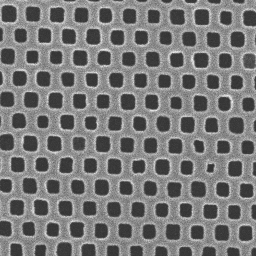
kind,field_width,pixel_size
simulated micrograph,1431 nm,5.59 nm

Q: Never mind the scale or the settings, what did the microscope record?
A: a regular array of holes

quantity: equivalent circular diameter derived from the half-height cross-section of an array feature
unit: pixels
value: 15.2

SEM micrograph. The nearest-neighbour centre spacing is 0.134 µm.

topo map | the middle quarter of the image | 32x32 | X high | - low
XXXXXXXXXXXXXXXX-XXXX---XXX---XX
XXXXXXXXXXXXXXXXXXXXXXXXXXXXXXXX
--XXXX--XXXX---XXX--XXXXXXXXXX--
---XX----XX----XX----XXX---XX---
---XXX---XX----XX----XXX---XX---
--XXXX--XXXX--XXXX--XXXX---XXX--
XXXXXXXXXXXXXXXXXXXXXXXXXXXXXXXX
XXX--XXXX--XXXX--XXXX-XXXXXXXXXX
XX---XXX---XXX----XX----XXX--XXX
XX---XXX---XXX----XX----XXX---XX
XX---XXX---XXX----XX----XX----XX
XXXXXXXXXXXXXXX--XXXXX-XXXXXXXXX
XXXXXXXXXXXXXXXXXXXXXXXXXXXXXXXX
--XXXX--XXX---XXX---XXX---XXXX--
---XX---XXX----XX---XXX----XX---
---XX---XXX----XX----XX----XX---
--XXXXXXXXX---XXXX--XXXX--XXX---
XXXXXXXXXXXXXXXXXXXXXXXXXXXXXXXX
XX--XXXX---XXX---XXXX-XXXXXXXXXX
XX---XXX----XX----XX---XXX---XXX
XX---XXX----XX----XX---XXX----XX
XXX--XXX---XXX---XXX---XXX----XX
XXXXXXXXXXXXXXXXXXXXXXXXXXX--XXX
--XXXXXXXXXXXXXXXXXXXXXXXXXXXXXX
--XXX---XXX---XXX---XXX---XXXX--
--XXX---XXX---XXX---XXX---XXX---
--XXX---XXX---XXX---XXX---XXX---
XXXXXXXXXXXX--XXXXXXXXXX--XXX---
XXXXXXXXXXXXXXXXXXXXXXXXXXXXXXXX
XX---XXX---XXX--XXXX--XXXXX-XXXX
XX---XXX---XXX---XXX---XXX---XXX
XX---XXX---XXX---XXX---XXX---XXX